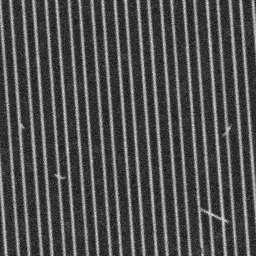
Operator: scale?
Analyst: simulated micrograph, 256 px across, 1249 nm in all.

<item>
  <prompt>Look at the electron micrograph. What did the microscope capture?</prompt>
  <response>parallel lines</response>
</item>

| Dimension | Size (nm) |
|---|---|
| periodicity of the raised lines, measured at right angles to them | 56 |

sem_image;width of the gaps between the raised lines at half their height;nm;45.1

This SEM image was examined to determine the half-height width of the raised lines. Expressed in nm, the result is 9.1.